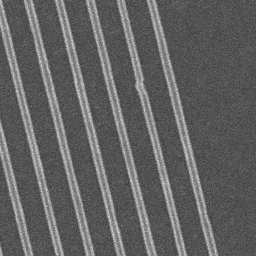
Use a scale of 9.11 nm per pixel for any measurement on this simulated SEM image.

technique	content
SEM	parallel lines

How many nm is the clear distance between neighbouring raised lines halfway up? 223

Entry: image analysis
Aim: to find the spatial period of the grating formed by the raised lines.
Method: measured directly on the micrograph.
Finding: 272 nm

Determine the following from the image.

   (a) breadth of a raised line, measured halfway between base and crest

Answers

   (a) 0.052 microns